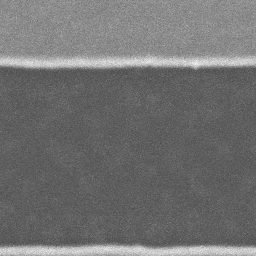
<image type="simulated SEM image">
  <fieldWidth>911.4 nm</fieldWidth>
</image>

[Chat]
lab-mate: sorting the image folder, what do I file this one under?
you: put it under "one or a few lines or trenches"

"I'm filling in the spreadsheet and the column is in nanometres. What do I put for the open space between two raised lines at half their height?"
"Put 666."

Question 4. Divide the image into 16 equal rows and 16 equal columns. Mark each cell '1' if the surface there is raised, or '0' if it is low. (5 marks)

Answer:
1111111111111111
1111111111111111
1111111111111111
1111111111111111
0000000000000000
0000000000000000
0000000000000000
0000000000000000
0000000000000000
0000000000000000
0000000000000000
0000000000000000
0000000000000000
0000000000000000
0000000000000000
0000000000000000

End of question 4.